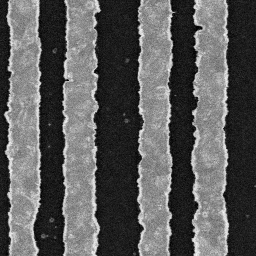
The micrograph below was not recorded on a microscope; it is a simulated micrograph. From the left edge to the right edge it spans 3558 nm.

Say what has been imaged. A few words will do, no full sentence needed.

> one or a few lines or trenches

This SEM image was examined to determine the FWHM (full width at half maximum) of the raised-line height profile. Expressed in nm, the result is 413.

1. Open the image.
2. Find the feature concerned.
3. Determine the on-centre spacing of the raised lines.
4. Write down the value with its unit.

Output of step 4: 0.866 um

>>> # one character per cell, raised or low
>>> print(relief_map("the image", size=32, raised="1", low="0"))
01111000111100000011100001110000
01111000111100000111100011110000
01111000111100000111100011110000
01111000111100000011100001110000
01111000111100000011100001110000
01111000111100000011110011110000
01111000111100000011100001110000
01111000111100000111100001110000
01111000111100000111100001110000
01111000111100000111100011110000
01111000111100000011100011110000
01111000111100000011100011110000
01111000111100000011100001110000
01111000111100000011100001110000
01111000111100000011100011110000
01111000111100000011100011110000
01111000111100000011100001110000
01111000111100000011100001110000
01111000111100000111100011110000
01111000111100000011100011110000
01111000111100000111100011110000
01111000111100000011100011110000
01111000111100000111100001110000
01111000111100000011100011110000
01111000111100000111100001110000
01111000111100000011100001110000
01111000111100000011100001110000
01110000111100000011100011110000
01110000111100000011100011110000
01110000111100000011100011110000
01110000111100000111100011110000
01111000111100000011100011110000